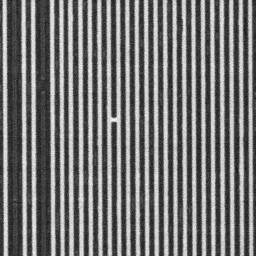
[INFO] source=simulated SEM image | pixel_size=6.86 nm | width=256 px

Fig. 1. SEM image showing parallel lines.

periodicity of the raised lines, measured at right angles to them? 64.7 nm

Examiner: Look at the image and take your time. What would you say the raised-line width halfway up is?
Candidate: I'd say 18.9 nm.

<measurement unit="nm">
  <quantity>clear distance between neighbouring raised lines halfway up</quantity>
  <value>43.7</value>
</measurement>